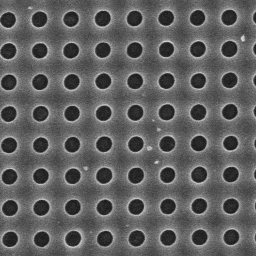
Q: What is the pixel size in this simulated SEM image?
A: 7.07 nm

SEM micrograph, a regular array of holes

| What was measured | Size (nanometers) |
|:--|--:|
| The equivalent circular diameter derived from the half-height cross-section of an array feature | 113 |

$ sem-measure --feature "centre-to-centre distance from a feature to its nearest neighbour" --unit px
31.2